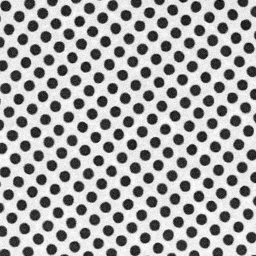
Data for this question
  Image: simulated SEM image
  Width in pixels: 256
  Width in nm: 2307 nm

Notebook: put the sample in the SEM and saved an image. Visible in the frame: a regular array of holes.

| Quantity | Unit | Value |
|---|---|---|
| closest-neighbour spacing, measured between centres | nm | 146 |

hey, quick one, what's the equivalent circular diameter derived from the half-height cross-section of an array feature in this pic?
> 100 nm